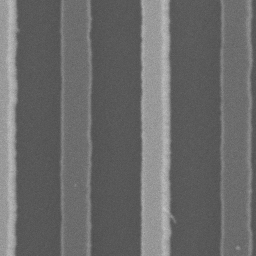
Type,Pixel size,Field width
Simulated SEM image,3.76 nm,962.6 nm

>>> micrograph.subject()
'lines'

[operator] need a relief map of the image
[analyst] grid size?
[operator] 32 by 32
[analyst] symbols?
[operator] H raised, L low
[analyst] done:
HHLLLLLLHHHLLLLLLLHHHLLLLLLLHHHL
HHLLLLLLHHHLLLLLLLHHHLLLLLLLHHHL
HHLLLLLLHHHLLLLLLLHHHLLLLLLLHHHL
HHLLLLLLHHHLLLLLLLHHHLLLLLLLHHHL
HHLLLLLLHHHLLLLLLLHHHLLLLLLLHHHL
HHLLLLLLHHHLLLLLLLHHHLLLLLLLHHHL
HHLLLLLLHHHLLLLLLLHHHLLLLLLLHHHL
HHLLLLLLHHHLLLLLLLHHHLLLLLLLHHHL
HHLLLLLLHHHLLLLLLLHHHLLLLLLLHHHL
HHLLLLLLHHHLLLLLLLHHHLLLLLLLHHHL
HHLLLLLLHHHLLLLLLLHHHLLLLLLLHHHL
HHLLLLLLHHHLLLLLLLHHHLLLLLLLHHHL
HHLLLLLLHHHLLLLLLLHHHLLLLLLLHHHL
HHLLLLLLHHHLLLLLLLHHHLLLLLLLHHHL
HHLLLLLLHHHLLLLLLLHHHLLLLLLLHHHL
HHLLLLLLHHHLLLLLLLHHHLLLLLLLHHHL
HHLLLLLLHHHLLLLLLLHHHLLLLLLLHHHL
HHLLLLLLHHHLLLLLLLHHHLLLLLLLHHHL
HHLLLLLLHHHLLLLLLLHHHLLLLLLLHHHL
HHLLLLLLHHHLLLLLLLHHHLLLLLLLHHHL
HHLLLLLLHHHLLLLLLLHHHLLLLLLLHHHL
HHLLLLLLHHHLLLLLLLHHHLLLLLLLHHHL
HHLLLLLLHHHLLLLLLLHHHLLLLLLLHHHL
HHLLLLLLHHHLLLLLLLHHHLLLLLLLHHHL
HHLLLLLLHHHLLLLLLLHHHLLLLLLLHHHL
HHLLLLLLHHHLLLLLLLHHHLLLLLLLHHHL
HHLLLLLLHHHLLLLLLLHHHLLLLLLLHHHL
HHLLLLLLHHHLLLLLLLHHHLLLLLLLHHHL
HHLLLLLLHHHLLLLLLLHHHLLLLLLLHHHL
HHLLLLLLHHHLLLLLLLHHHLLLLLLLHHHL
HHLLLLLLHHHLLLLLLLHHHLLLLLLLHHHL
HHLLLLLLHHHLLLLLLLHHHLLLLLLLHHHL